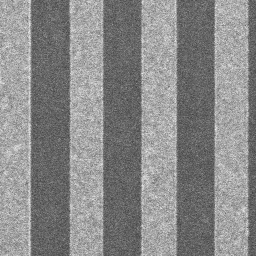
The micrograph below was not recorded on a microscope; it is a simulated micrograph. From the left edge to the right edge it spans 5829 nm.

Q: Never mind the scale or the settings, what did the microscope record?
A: one or a few lines or trenches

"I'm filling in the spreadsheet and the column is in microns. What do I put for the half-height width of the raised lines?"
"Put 0.723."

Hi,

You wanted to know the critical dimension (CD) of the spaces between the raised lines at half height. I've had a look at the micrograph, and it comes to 916 nm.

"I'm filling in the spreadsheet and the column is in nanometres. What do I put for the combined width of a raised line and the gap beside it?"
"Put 1650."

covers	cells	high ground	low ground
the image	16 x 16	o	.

oo..oo...oo..oo.
oo..oo...oo..oo.
oo..oo...oo..oo.
oo..oo...oo..oo.
oo..oo...oo..oo.
oo..oo...oo..oo.
oo..oo...oo...o.
oo..oo...oo..oo.
oo..oo...oo..oo.
oo..oo...oo..oo.
oo..oo...oo..oo.
oo..oo...oo..oo.
oo..oo...oo..oo.
oo..oo...oo...o.
oo..oo...oo..oo.
oo..oo...oo..oo.